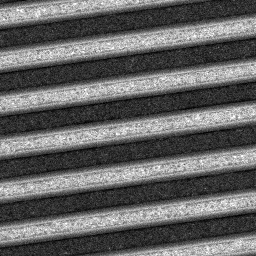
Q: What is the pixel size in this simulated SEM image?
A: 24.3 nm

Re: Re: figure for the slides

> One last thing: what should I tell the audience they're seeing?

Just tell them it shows parallel lines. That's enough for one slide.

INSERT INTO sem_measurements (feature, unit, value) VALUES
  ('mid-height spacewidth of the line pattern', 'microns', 0.573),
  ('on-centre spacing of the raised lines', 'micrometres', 1.05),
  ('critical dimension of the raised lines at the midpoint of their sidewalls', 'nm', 482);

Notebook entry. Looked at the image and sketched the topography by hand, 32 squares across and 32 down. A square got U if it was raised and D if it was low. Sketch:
DDUUUUUUUUUUUUUUUUUUUDDDDDDDDDDD
UUUUUUUUUUUUUDDDDDDDDDDDDDDDDDDD
UUUUUUDDDDDDDDDDDDDDDDDDDDDDUUUU
DDDDDDDDDDDDDDDDDDDDDUUUUUUUUUUU
DDDDDDDDDDDDDDUUUUUUUUUUUUUUUUUD
DDDDDDDUUUUUUUUUUUUUUUUUDDDDDDDD
UUUUUUUUUUUUUUUUDDDDDDDDDDDDDDDD
UUUUUUUUUDDDDDDDDDDDDDDDDDDDDDDD
UUDDDDDDDDDDDDDDDDDDDDDDDUUUUUUU
DDDDDDDDDDDDDDDDUUUUUUUUUUUUUUUU
DDDDDDDDDDUUUUUUUUUUUUUUUUUDDDDD
DDDUUUUUUUUUUUUUUUUUDDDDDDDDDDDD
UUUUUUUUUUUUUDDDDDDDDDDDDDDDDDDD
UUUUUUDDDDDDDDDDDDDDDDDDDDDUUUUU
DDDDDDDDDDDDDDDDDDDDUUUUUUUUUUUU
DDDDDDDDDDDDDUUUUUUUUUUUUUUUUUUD
DDDDDUUUUUUUUUUUUUUUUUUDDDDDDDDD
UUUUUUUUUUUUUUUUDDDDDDDDDDDDDDDD
UUUUUUUUUDDDDDDDDDDDDDDDDDDDDDUU
UUDDDDDDDDDDDDDDDDDDDDDUUUUUUUUU
DDDDDDDDDDDDDDDDUUUUUUUUUUUUUUUU
DDDDDDDDDUUUUUUUUUUUUUUUUUUDDDDD
DDUUUUUUUUUUUUUUUUUDDDDDDDDDDDDD
UUUUUUUUUUUUDDDDDDDDDDDDDDDDDDDD
UUUUUDDDDDDDDDDDDDDDDDDDDDUUUUUU
DDDDDDDDDDDDDDDDDDDUUUUUUUUUUUUU
DDDDDDDDDDDDUUUUUUUUUUUUUUUUUUDD
DDDDDUUUUUUUUUUUUUUUUUUDDDDDDDDD
UUUUUUUUUUUUUUUUDDDDDDDDDDDDDDDD
UUUUUUUUDDDDDDDDDDDDDDDDDDDDDDUU
UDDDDDDDDDDDDDDDDDDDDDDUUUUUUUUU
DDDDDDDDDDDDDDDUUUUUUUUUUUUUUUUU